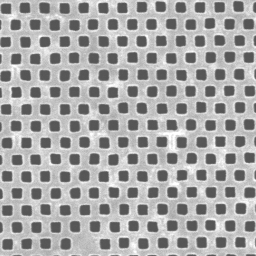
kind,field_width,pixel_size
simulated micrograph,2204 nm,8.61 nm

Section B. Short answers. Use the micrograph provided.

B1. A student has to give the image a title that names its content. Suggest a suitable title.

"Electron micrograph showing a regular array of holes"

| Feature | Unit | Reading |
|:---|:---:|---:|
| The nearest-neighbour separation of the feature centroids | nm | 162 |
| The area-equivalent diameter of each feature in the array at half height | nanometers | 101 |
